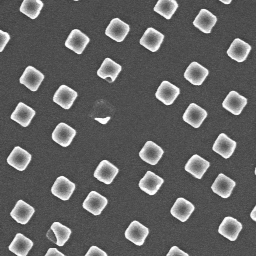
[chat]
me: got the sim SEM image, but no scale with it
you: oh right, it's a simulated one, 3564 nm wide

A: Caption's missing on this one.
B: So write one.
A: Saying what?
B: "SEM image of a regular array of raised bodies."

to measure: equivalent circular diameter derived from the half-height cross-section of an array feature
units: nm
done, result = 297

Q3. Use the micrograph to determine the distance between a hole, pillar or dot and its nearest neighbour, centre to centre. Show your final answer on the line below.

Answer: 0.515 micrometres